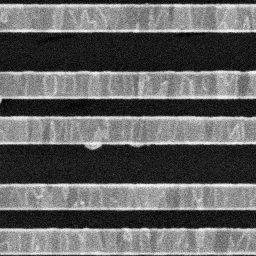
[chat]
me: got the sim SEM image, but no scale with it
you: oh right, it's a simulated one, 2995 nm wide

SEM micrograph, lines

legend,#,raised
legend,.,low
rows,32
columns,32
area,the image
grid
................................
################################
################################
################################
................................
................................
................................
................................
................................
################################
################################
################################
................................
................................
................................
################################
################################
################################
................................
................................
................................
................................
................................
################################
################################
################################
................................
................................
................................
################################
################################
################################